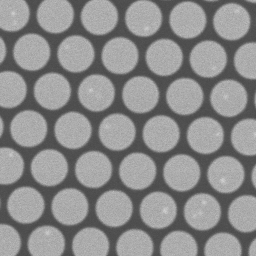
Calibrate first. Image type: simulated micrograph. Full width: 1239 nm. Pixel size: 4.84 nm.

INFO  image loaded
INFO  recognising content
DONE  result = an array of small figures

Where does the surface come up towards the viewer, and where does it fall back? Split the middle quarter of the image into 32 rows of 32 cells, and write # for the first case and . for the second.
######....########...########...
.####......######.....######....
.......................####.....
......#####......####...........
#...########....#######....#####
#...########...########...######
##..#########..#########..######
##.#########...#########..######
#...########...#########..######
#...########...########...######
.....######.....#######...######
......####......######.....#####
####........##...............###
######....######......#####.....
######...########....#######....
#######..#########..########...#
#######..#########..#########..#
#######..#########..#########..#
######...#########..#########..#
######...########...########...#
#####.....######.....#######...#
............##........#####.....
.....#####.......###............
....#######....#######.....#####
#..#########..########....######
#..#########..#########..#######
#..#########..#########..#######
#..#########..#########..#######
...########...#########..#######
....#######....#######....######
.....####.......#####.....######
###.........................###.